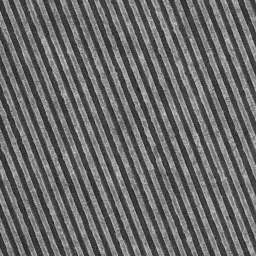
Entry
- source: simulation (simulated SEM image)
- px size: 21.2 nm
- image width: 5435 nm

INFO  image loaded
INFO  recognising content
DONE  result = parallel lines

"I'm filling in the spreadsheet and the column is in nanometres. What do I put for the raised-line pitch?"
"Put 227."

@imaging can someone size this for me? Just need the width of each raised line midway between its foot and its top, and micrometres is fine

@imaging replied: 0.0817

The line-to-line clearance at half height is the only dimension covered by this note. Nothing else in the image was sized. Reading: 6.65 pixels